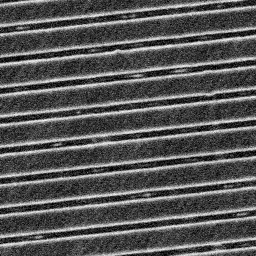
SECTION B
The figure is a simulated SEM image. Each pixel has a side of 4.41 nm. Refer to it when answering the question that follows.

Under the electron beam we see parallel lines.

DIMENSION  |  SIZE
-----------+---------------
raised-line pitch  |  0.132 micrometres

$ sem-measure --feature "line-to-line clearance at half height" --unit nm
29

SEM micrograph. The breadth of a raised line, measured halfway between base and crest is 100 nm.